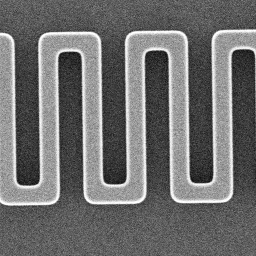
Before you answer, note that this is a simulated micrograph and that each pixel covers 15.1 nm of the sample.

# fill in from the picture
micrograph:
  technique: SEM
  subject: groups of lines, slits or small figures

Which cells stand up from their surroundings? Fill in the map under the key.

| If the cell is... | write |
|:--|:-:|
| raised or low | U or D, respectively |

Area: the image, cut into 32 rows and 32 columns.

DDDDDDDDDDDDDDDDDDDDDDDDDDDDDDDD
DDDDDDDDDDDDDDDDDDDDDDDDDDDDDDDD
DDDDDDDDDDDDDDDDDDDDDDDDDDDDDDDD
DDDDDDDDDDDDDDDDDDDDDDDDDDDDDDDD
UDDDDUUUUUUUDDDDUUUUUUUDDDDUUUUU
UUDDDUUUUUUUUDDDUUUUUUUDDDDUUUUU
UUDDDUUUDDUUUDDDUUDDDUUDDDDUUDDD
UUDDDUUDDDUUUDDDUUDDDUUDDDDUUDDD
UUDDDUUDDDUUUDDDUUDDDUUDDDDUUDDD
UUDDDUUDDDUUUDDDUUDDDUUDDDDUUDDD
UUDDDUUDDDUUUDDDUUDDDUUDDDDUUDDD
UUDDDUUDDDUUUDDDUUDDDUUDDDDUUDDD
UUDDDUUDDDUUUDDDUUDDDUUDDDDUUDDD
UUDDDUUDDDUUUDDDUUDDDUUDDDDUUDDD
UUDDDUUDDDUUUDDDUUDDDUUUDDDUUDDD
UUDDDUUDDDUUUDDDUUDDDUUUDDDUUDDD
UUDDDUUDDDUUUDDDUUDDDUUUDDDUUDDD
UUDDDUUDDDUUUDDDUUDDDUUUDDDUUDDD
UUDDDUUDDDUUUDDDUUDDDUUUDDDUUDDD
UUDDDUUDDDUUUDDDUUDDDUUUDDDUUDDD
UUDDDUUDDDUUUDDDUUDDDUUUDDDUUDDD
UUDDDUUDDDUUUDDDUUDDDUUUDDDUUDDD
UUDDDUUDDDUUUDDDUUDDDUUUDDDUUDDD
UUUUUUUDDDUUUUUUUUDDDUUUUUUUUDDD
UUUUUUUDDDDUUUUUUUDDDUUUUUUUUDDD
DUUUUUDDDDDDDDDDDDDDDDDDDDDDDDDD
DDDDDDDDDDDDDDDDDDDDDDDDDDDDDDDD
DDDDDDDDDDDDDDDDDDDDDDDDDDDDDDDD
DDDDDDDDDDDDDDDDDDDDDDDDDDDDDDDD
DDDDDDDDDDDDDDDDDDDDDDDDDDDDDDDD
DDDDDDDDDDDDDDDDDDDDDDDDDDDDDDDD
DDDDDDDDDDDDDDDDDDDDDDDDDDDDDDDD